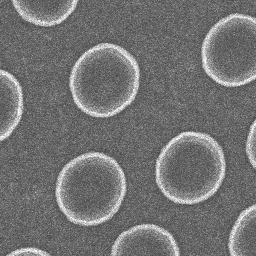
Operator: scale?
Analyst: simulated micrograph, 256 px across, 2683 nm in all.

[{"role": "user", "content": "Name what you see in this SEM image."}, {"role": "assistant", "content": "raised bodies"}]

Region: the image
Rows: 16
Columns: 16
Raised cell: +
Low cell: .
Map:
.++++...........
..............++
.............+++
.....+++.....+++
.....++++....+++
+....+++........
+....+++........
+...............
...........++...
..........++++..
....+++...++++..
....++++..++++..
....++++...+....
....+++........+
........++.....+
.......++++...++